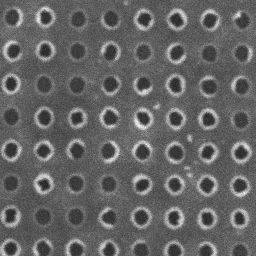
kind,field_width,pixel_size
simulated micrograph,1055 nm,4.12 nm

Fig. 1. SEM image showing a regular array of holes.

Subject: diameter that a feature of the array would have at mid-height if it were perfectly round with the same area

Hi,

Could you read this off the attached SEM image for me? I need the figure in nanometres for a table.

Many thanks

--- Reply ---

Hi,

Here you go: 60.3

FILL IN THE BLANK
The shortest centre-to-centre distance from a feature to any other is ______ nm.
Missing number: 132